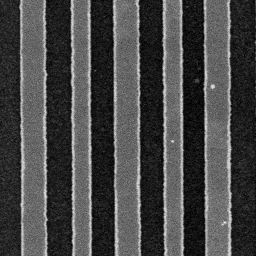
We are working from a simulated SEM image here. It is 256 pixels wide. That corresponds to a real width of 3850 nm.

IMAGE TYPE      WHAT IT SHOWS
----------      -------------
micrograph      lines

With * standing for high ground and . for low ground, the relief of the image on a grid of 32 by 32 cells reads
...***...**...***...***...***...
...***...**...***...***...***...
...***...**...***...***...***...
...***...**...***...***...***...
...***...**...***...***...***...
...***...**...***...***...***...
...***...**...***...***...***...
...***...**...***...***...***...
...***...**...***...***...***...
...***...**...***...***...***...
...***...**...***...***...***...
...***...**...***...***...***...
...***...**...***...***...***...
...***...**...***...***...***...
...***...**...***...***...***...
...***...**...***...***...***...
...***...**...***...***...***...
...***...**...***...***...***...
...***...**...***...***...***...
...***...**...***...***...***...
...***...**...***...***...***...
...***...**...***...***...***...
...***...**...***...***...***...
...***...**...***...***...***...
...***...**...***...***...***...
...***...**...****..***...***...
...***...**...***...***...***...
...***...**...****..***...***...
...***...**...****..***...***...
...***...**...****..***...***...
...***...**...****...**...***...
...***...**...****...**...***...